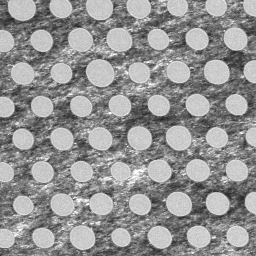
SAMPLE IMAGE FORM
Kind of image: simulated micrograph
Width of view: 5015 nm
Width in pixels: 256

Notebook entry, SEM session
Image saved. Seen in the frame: a regular array of raised bodies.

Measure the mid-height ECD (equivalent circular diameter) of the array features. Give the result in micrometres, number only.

0.444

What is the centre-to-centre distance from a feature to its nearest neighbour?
745 nm